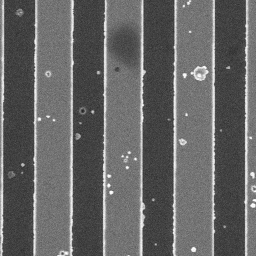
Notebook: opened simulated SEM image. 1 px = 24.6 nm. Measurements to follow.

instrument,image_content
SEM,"lines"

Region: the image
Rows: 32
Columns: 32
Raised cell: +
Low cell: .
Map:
....+++++....+++++....+++++....+
....+++++....+++++....+++++....+
....+++++....+++++....+++++....+
....+++++....+++++....+++++....+
....+++++....+++++....+++++....+
....+++++....+++++....+++++....+
....+++++....+++++....+++++....+
....+++++....+++++....+++++....+
....+++++....+++++....+++++....+
....+++++....+++++....+++++....+
....+++++....+++++....+++++....+
....+++++....+++++....+++++....+
....+++++....+++++....+++++....+
....+++++....+++++....+++++....+
....+++++....+++++....+++++....+
....+++++....+++++....+++++....+
....+++++....+++++....+++++....+
....+++++....+++++....+++++....+
....+++++....+++++....+++++....+
....+++++....+++++....+++++....+
....+++++....+++++....+++++....+
....+++++....+++++....+++++....+
....+++++....+++++....+++++....+
....+++++....+++++....+++++....+
....+++++....+++++....+++++....+
....+++++....+++++....+++++....+
....+++++....+++++....+++++....+
....+++++....+++++....+++++....+
....+++++....+++++....+++++....+
....+++++....+++++....+++++....+
....+++++....+++++....+++++....+
....+++++....+++++....+++++....+